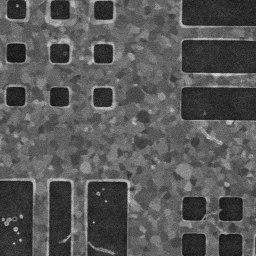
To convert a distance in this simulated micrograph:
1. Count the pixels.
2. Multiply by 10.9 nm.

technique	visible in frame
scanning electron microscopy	groups of lines, slits or small figures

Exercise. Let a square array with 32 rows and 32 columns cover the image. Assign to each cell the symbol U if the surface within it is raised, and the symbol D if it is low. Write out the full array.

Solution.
UDDUUUDDDUUDDDUUUUUUUUUDDDDDDDDD
UDDDUUDDDUUDDDUUUUUUUUUDDDDDDDDD
UUDUUUDDDUUUDDUUUUUUUUUDDDDDDDDD
UUUUUUUUUUUUUUUUUUUUUUUUUUUUUUUU
UUUUUUUUUUUUUUUUUUUUUUUUUUUUUUUU
UDDUUUDDDUUUDDUUUUUUUUUDDDDDDDDD
UDDUUUDDDUUUDDUUUUUUUUUDDDDDDDDD
UDDUUUDDDUUUDDUUUUUUUUUDDDDDDDDD
UUUUUUUUUUUUUUUUUUUUUUUDDDDDDDDD
UUUUUUUUUUUUUUUUUUUUUUUUUUUUUUUU
UUUUUUUUUUUUUUUUUUUUUUUUUUUUUUUU
UDDUUUDDDUUUDDUUUUUUUUUDDDDDDDDD
UDDUUUDDDUUDDDUUUUUUUUUDDDDDDDDD
UUUUUUUUUUUUDDUUUUUUUUUDDDDDDDDD
UUUUUUUUUUUUUUUUUUUUUUUDDDDDDDDD
UUUUUUUUUUUUUUUUUUUUUUUUUUUUUUUU
UUUUUUUUUUUUUUUUUUUUUUUUUUUUUUUU
UUUUUUUUUUUUUUUUUUUUUUUUUUUUUUUU
UUUUUUUUUUUUUUUUUUUUUUUUUUUUUUUU
UUUUUUUUUUUUUUUUUUUUUUUUUUUUUUUU
UUUUUUUUUUUUUUUUUUUUUUUUUUUUUUUU
UUUUUUUUUUUUUUUUUUUUUUUUUUUUUUUU
DDDDUUUDUUUUDDDUUUUUUUUUUUUUUUUU
DDDDUUDDDUUDDDDDUUUUUUUUUUUUUUUU
DDDDUUDDDUUDDDDDUUUUUUUUDUUUUUUU
DDDDUUDDDUUDDDDDUUUUUUUDDDUDDDUU
DDDDUUDDDUUDDDDDUUUUUUUDDDUDDDUU
DDDDUUDDDUUDDDDDUUUUUUUDDUUUDDUU
DDDDUUDDDUUDDDDDUUUUUUUUUUUUUUUU
DDDDUUDDDUUDDDDDUUUUUUUDDDUUDDUU
DDDDUUDDDUUDDDDDUUUUUUUDDDUDDDUU
DDDDUUDDDUUDDDDDUUUUUUUDDDUDDDUU